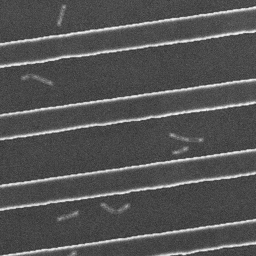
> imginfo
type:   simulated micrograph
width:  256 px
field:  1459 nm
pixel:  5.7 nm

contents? lines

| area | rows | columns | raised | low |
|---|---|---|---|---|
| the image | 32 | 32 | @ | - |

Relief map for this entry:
--------------------------------
---------------------------@@@@@
--------------------@@@@@@@@@@@@
--------------@@@@@@@@@@@@@@@@@@
-------@@@@@@@@@@@@@@@@@@@@@----
@@@@@@@@@@@@@@@@@@@@@-----------
@@@@@@@@@@@@@@------------------
@@@@@@@-------------------------
--------------------------------
--------------------------------
---------------------------@@@@@
--------------------@@@@@@@@@@@@
-------------@@@@@@@@@@@@@@@@@@@
------@@@@@@@@@@@@@@@@@@@@@@----
@@@@@@@@@@@@@@@@@@@@@-----------
@@@@@@@@@@@@@@------------------
@@@@@@@-------------------------
--------------------------------
--------------------------------
--------------------------@@@@@@
-------------------@@@@@@@@@@@@@
------------@@@@@@@@@@@@@@@@@@@@
-----@@@@@@@@@@@@@@@@@@@@@@-----
@@@@@@@@@@@@@@@@@@@@------------
@@@@@@@@@@@@@-------------------
@@@@@@--------------------------
--------------------------------
-------------------------------@
-------------------------@@@@@@@
------------------@@@@@@@@@@@@@@
----------@@@@@@@@@@@@@@@@@@@@@-
---@@@@@@@@@@@@@@@@@@@@@--------